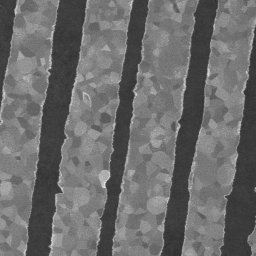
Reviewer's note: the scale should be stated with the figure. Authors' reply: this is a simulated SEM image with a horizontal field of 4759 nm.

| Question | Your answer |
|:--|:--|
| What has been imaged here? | one or a few lines or trenches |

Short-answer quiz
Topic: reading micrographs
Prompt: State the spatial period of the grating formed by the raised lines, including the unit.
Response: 1200 nanometers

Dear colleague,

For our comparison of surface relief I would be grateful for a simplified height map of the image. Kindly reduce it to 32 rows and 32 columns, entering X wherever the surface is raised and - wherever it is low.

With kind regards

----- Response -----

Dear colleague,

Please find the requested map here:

--XXXXX----XXXXXX--XXXXXX--XXXXX
--XXXXX----XXXXX---XXXXX---XXXXX
--XXXXX----XXXXX--XXXXXX---XXXXX
--XXXXX---XXXXXX--XXXXXX---XXXXX
--XXXXX---XXXXXX--XXXXXX---XXXXX
-XXXXXX---XXXXXX--XXXXXX--XXXXXX
-XXXXX----XXXXXX--XXXXXX--XXXXX-
-XXXXX----XXXXX---XXXXXX--XXXXX-
-XXXXX----XXXXX--XXXXXX---XXXXX-
-X-XXX----XXXXX--XXXXXX---XXXXX-
XXXXXX---XXXXXX--XXXXXX---XXXXX-
XXXXXX---XXXXXX--XXXXXX---XXXX--
XXXXXX---XXXXXX--XX-XXX---XXXXX-
XXXXX----XXXXXX--XXXXXX---XXXX--
XXXXX----XXXXX---XXXXXX--XXXXX--
XXXXX---XXXXXX--XXXXXX---XXXXX--
XXXXX---XXXXXX--XXXXXX---XXXXX--
XXXXX---XXXXXX--XXX--X---XXXXX--
-XXXX---XXXXXX--XXXXXX---XXXXX--
XXXXX---XXXXXX--XXXXXX--XXXXXX--
XXXXX---XXXXXX--XXXXXX--XXXXX---
XXXXX--XXXXXXX--XXXXXX--XXXXX---
XXXX---XXXXXX--XXXXXX---XXXXX---
XXXX----XXXXX--XXXXXX---XXXXX---
XXXX---XXXXXX--XXXXXX---XXXX----
XXXX---XXXXXX--XXXXXX---XXXX----
XXXX---XXXXXX--XXXXXX---XXXX----
XXXX---XXXXXX--XXXXXX--XXXXX----
XXX----XXXXXX-XXXXXX---XXXXX----
XXX----XXX-X--XXXXXX---XXXXX---X
XXX---XXXXXX--XXXXXX---XXXXX---X
XXX---XXXXXX--XXXXXX---XXXXX---X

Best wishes